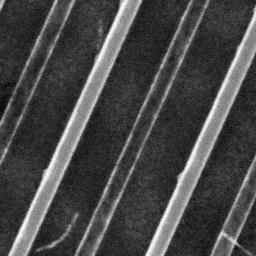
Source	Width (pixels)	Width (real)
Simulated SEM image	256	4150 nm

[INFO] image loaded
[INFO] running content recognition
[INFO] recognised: lines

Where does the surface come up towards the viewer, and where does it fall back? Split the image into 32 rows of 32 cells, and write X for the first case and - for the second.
-------XX-------X-------XX------
------XXX------XX------XX-------
------XX-------XX------XX-------
-----XXX------XX------XXX------X
-----XX-------XX------XX-------X
----XXX------XX------XXX------XX
----XX-------XX------XX-------XX
----XX------XX------XXX------XX-
---XXX------XX------XX-------XX-
---XX------XX-------XX------XXX-
--XXX------XX------XX-------XX--
--XX------XXX------XX-------XX--
-XXX------XX------XXX------XX---
-XX------XXX------XX-------XX---
XXX------XX------XXX------XX----
XX-------XX------XX-------XX----
XX------XX------XXX------XX-----
X-------XX------XX-------XX-----
X------XX-------XX------XX------
X------XX------XX-------XX------
------XX-------XX-------XX------
------XX------XX-------XX------X
------XX------XX-------XX------X
-----XX------XXX------XX------XX
-----XX------XX-------XX------XX
----XX------XXX------XX------XXX
----XX------XX-------XX------XX-
---XX------XXX------XX------XXX-
---XX------XX-------XX------XX--
--XX-------XX-------X------XXX--
--XX------XX-------XX------XX---
-XX-------XX-------XX------XX---